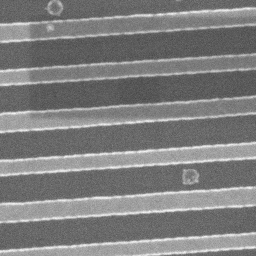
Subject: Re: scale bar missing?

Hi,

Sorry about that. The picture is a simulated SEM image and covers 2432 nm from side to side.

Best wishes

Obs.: lines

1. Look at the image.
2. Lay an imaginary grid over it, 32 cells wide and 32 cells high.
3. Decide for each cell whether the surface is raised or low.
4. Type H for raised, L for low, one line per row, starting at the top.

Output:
LLLLLLLLLLLLLLLLLLLLLLLLLLLLLLLL
LLLLLLLLLLLLLLLLLLLLLLLHHHHHHHHH
LLLLLLLLLLHHHHHHHHHHHHHHHHHHHHHH
HHHHHHHHHHHHHHHHHHHHHHHHHHLLLLLL
HHHHHHHHHHHHLLLLLLLLLLLLLLLLLLLL
LLLLLLLLLLLLLLLLLLLLLLLLLLLLLLLL
LLLLLLLLLLLLLLLLLLLLLLLLLLLLLLLL
LLLLLLLLLLLLLLLLLLLLHHHHHHHHHHHH
LLLLLHHHHHHHHHHHHHHHHHHHHHHHHHHH
HHHHHHHHHHHHHHHHHHLLLLLLLLLLLLLL
HHHLLLLLLLLLLLLLLLLLLLLLLLLLLLLL
LLLLLLLLLLLLLLLLLLLLLLLLLLLLLLLL
LLLLLLLLLLLLLLLLLLLLLLLLLLHHHHHH
LLLLLLLLLLLLHHHHHHHHHHHHHHHHHHHH
HHHHHHHHHHHHHHHHHHHHHHHHHHHHLLLL
HHHHHHHHHHHHHHLLLLLLLLLLLLLLLLLL
HLLLLLLLLLLLLLLLLLLLLLLLLLLLLLLL
LLLLLLLLLLLLLLLLLLLLLLLLLLLLLLLL
LLLLLLLLLLLLLLLLLLLLLLLHHHHHHHHH
LLLLLLLLLHHHHHHHHHHHHHHHHHHHHHHH
HHHHHHHHHHHHHHHHHHHHHLLLLLLLLLLL
HHHHHHHLLLLLLLLLLLLLLLLLLLLLLLLL
LLLLLLLLLLLLLLLLLLLLLLLLLLLLLLLL
LLLLLLLLLLLLLLLLLLLLLLLLLLLLLLHH
LLLLLLLLLLLLLLLLHHHHHHHHHHHHHHHH
LHHHHHHHHHHHHHHHHHHHHHHHHHHHHHHH
HHHHHHHHHHHHHHHHHHHLLLLLLLLLLLLL
HHHHHLLLLLLLLLLLLLLLLLLLLLLLLLLL
LLLLLLLLLLLLLLLLLLLLLLLLLLLLLLLL
LLLLLLLLLLLLLLLLLLLLLLLLLLHHHHHH
LLLLLLLLLLLLLHHHHHHHHHHHHHHHHHHH
HHHHHHHHHHHHHHHHHHHHHHHHHLLLLLLL